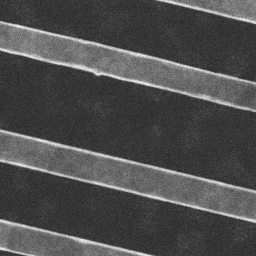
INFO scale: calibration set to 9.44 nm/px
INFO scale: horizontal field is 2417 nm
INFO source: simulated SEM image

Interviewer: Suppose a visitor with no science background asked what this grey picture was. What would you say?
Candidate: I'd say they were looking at one or a few lines or trenches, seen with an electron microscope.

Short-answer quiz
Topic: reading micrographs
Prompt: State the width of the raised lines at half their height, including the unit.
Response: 268 nm